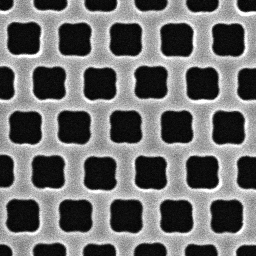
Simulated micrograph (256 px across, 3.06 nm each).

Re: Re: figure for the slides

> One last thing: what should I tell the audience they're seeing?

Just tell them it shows a regular array of holes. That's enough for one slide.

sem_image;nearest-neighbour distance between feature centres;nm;153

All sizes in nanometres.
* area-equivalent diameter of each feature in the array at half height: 110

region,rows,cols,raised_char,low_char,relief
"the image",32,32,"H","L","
LLHHLLLLHHHLLLLHHLLLLHHLLLLHHHLL
HHHHHHHHHHHHHHHHHHHHHHHHLLLHHHLH
HHHHHHHHHHHHHHHHHHHHHHHHHHHHHHHH
HLLLLHHLLLLHHHLLLLHHLLLLHHHLLLHH
HLLLLHHLLLLHHHLLLLHHLLLLHHHLLLLH
HLLLLHHLLLLHHHLLLLHHLLLLHHHLLLLH
HLLLLHHHLLLHHHLLLLHHLLLLHHHLLLHH
HHHHHHHHHHHHHHHHHHHHHHHHHHHHHHHH
LHHHHLLLHHHLHLHHHLLLLHHHLLLHHHHL
LLHHLLLLHHLLLLLHHLLLLHHLLLLHHHLL
LLHHLLLLHHLLLLLHHLLLLHHLLLLHHHLL
LLHHLLLLHHLLLLLHHLLLLHHLLLLHHHLL
HHHHHHHHHHHLHLHHHHHHHHHHLLHHHHHH
HHHHHHHHHHHHHHHHHHHHHHHHHHHHHHHH
HLLLLHHLLLLHHHLLLLHHLLLLHHHLLLHH
HLLLLHHLLLLHHHLLLLHHLLLLHHHLLLLH
HLLLLHHLLLLHHHLLLLHHLLLLHHHLLLLH
HLLLLHHHLLLHHHLLLLHHLLLLHHHLLLHH
HHHHHHHHHHHHHHHHHHHHHHHHHHHHHHHH
LHHHHLLHHHHHHHHHHLHHHHHHLLHHHHHH
LLHHLLLLHHLLLLLHHLLLLHHLLLLHHHLL
LLHHLLLLHHLLLLLHHLLLLHHLLLLHHHLL
LLHHLLLLHHLLLLLHHLLLLHHLLLLHHHLL
HHHHHLLLHHHLLLHHHLLLHHHHLLLHHHLL
HHHHHHHHHHHHHHHHHHHHHHHHHHHHHHHH
HLLLLHHHLLLHHHLLLLHHLLLLHHLLLLHH
HLLLLHHLLLLLHHLLLLHHLLLLHHLLLLHH
HLLLLHHLLLLLHHLLLLHHLLLLHHLLLLHH
HLLLLHHHLLLHHHLLLLHHLLLLHHLLLLHH
HHHHHHHHHHHHHHHHHHHHHHHHHHHHHHHH
HHHHHLLLHHHLHLHHHHLLHHHHHHHHHHHH
LLHHLLLLHHLLLLLHHLLLLHHLLLLHHHLL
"